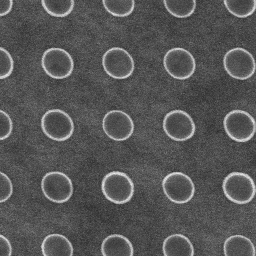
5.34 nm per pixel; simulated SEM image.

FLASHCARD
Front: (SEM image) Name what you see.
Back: a regular array of raised bodies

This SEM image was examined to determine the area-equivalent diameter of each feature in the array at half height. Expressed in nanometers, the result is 160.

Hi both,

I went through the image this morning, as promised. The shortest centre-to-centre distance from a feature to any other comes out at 323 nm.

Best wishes